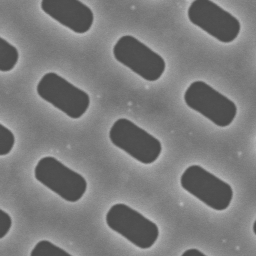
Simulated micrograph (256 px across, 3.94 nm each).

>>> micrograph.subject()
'holes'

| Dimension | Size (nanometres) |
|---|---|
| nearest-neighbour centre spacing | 330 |